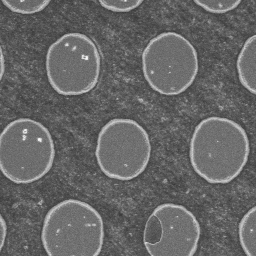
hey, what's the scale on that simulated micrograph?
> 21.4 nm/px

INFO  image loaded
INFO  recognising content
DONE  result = raised bodies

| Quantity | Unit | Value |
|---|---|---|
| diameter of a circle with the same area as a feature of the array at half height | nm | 1220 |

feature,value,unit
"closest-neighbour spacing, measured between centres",2060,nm